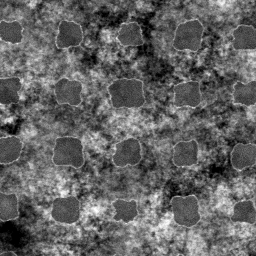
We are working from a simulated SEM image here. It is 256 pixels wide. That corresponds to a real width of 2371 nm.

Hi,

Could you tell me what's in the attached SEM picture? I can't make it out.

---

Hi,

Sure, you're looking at a regular array of raised bodies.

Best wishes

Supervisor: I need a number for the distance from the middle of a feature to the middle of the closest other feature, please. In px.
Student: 57.8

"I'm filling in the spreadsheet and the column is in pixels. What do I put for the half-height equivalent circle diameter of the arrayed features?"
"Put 28.4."